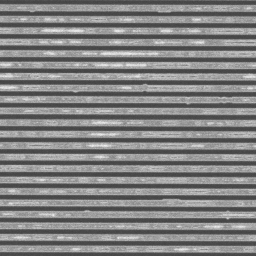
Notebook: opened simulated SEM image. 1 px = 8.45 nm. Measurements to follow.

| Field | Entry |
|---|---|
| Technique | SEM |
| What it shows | parallel lines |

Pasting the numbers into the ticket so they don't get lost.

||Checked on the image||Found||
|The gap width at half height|37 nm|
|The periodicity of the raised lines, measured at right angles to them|11.5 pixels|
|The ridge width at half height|0.0592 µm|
